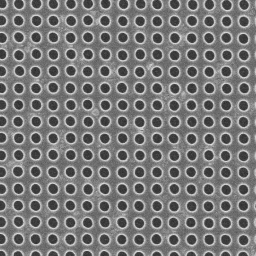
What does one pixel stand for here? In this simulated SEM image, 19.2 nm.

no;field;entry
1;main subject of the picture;a regular array of holes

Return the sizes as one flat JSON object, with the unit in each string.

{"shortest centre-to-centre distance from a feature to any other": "16.5 pixels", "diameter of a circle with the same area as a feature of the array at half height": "190 nanometres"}